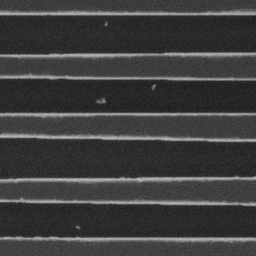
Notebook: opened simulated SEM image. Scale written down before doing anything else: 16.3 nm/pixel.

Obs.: lines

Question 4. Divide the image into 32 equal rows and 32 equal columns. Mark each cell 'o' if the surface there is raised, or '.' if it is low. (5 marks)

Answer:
oooooooooooooooooooooooooooooooo
oooooooooooooooooooooooooooooooo
................................
................................
................................
................................
................................
oooooooooooooooooooooooooooooooo
oooooooooooooooooooooooooooooooo
oooooooooooooooooooooooooooooooo
................................
................................
................................
................................
oooooooooooooooooooooooooooooooo
oooooooooooooooooooooooooooooooo
oooooooooooooooooooooooooooooooo
.....................ooooooooooo
................................
................................
................................
................................
oooooooooooooooooooooooooooooooo
oooooooooooooooooooooooooooooooo
oooooooooooooooooooooooooooooooo
.......................ooooooooo
................................
................................
................................
................................
oooooooooooooooooooooooooooooooo
oooooooooooooooooooooooooooooooo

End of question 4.